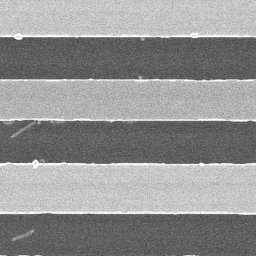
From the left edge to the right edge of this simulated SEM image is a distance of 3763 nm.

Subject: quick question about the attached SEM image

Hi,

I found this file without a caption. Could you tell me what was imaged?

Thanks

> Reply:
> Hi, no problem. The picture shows lines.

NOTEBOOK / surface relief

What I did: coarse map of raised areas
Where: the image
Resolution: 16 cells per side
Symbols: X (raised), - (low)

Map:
XXXXXXXXXXXXXXXX
XXXXXXXXXXXXXXXX
----------------
----------------
----------------
XXXXXXXXXXXXXXXX
XXXXXXXXXXXXXXXX
XXXXXXXXXXXXXXXX
----------------
----------------
XXXXXXXXXXXXXXXX
XXXXXXXXXXXXXXXX
XXXXXXXXXXXXXXXX
----------------
----------------
----------------